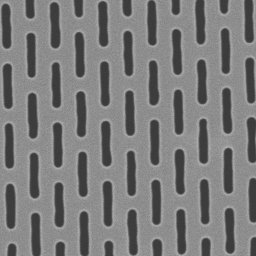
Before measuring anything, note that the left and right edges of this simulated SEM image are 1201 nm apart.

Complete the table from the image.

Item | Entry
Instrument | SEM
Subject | groups of lines, slits or small figures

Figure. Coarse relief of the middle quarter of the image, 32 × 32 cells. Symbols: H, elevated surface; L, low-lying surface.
HHHLLHHHHLLHHHHLLHHHHLLHHHHLLLHH
HHHLLHHHHLLHHHHLLHHHHLLLHHHLLLHH
HHHLLHHHHLLHHHHLLHHHHLLLHHHHLHHH
HHHHHHHHHLLHHHHHHHHHHLLLHHHHHHHH
HHHHHHHHHLLHHHHHHHHHHLLLHHHHHHHH
HHHHHHHHHLLHHHHHHHHHHLLLHHHHHHHH
HHHHHHHHHLLHHHHHHHHHHLLLHHHHLHHH
HHHLLHHHHLLHHHHLLHHHHLLLHHHLLLHH
HHHLLHHHHLLLHHHLLLHHHLLLHHHLLLHH
HHHLLHHHHLLHHHHLLLHHHLLLHHHLLLHH
HHHLLLHHHHLHHHHLLLHHHHHHHHHLLLHH
HHHLLLHHHHHHHHHLLLHHHHHHHHHLLLHH
HHHLLLHHHHHHHHHLLLHHHHHHHHHLLLHH
HHHLLLHHHHHHHHHLLLHHHHHHHHHLLLHH
HHHLLLHHHHLHHHHLLLHHHHLLHHHLLLHH
HHHLLLHHHLLLHHHLLLHHHLLLHHHHLLHH
HHHLLLHHHLLLHHHLLLHHHLLLHHHHLLHH
HHHLLHHHHLLLHHHHLLHHHLLLHHHHLHHH
HHHHHHHHHLLLHHHHHHHHHLLLHHHHHHHH
HHHHHHHHHLLLHHHHHHHHHLLLHHHHHHHH
HHHHHHHHHLLLHHHHHHHHHHLLHHHHHHHH
HHHHHHHHHLLLHHHHHHHHHHLLHHHHLLHH
HHHHLLHHHLLLHHHHLLHHHLLLHHHHLLHH
HHHLLLHHHLLLHHHHLLHHHLLLHHHHLLHH
HHHLLLHHHLLLHHHHLLHHHHLLHHHHLLHH
HHHLLLHHHHLHHHHHLLHHHHHHHHHHLLHH
HHHLLLHHHHHHHHHHLLHHHHHHHHHHLLHH
HHHLLLHHHHHHHHHHLLHHHHHHHHHHLLHH
HHHLLLHHHHHHHHHHLLHHHHHHHHHHLLHH
HHHLLLHHHHLLHHHHLLHHHHLLHHHHLLHH
HHHLLLHHHLLLHHHHLLHHHHLLHHHHLLHH
HHHLLLHHHLLLHHHHLLHHHHLLHHHHLLHH